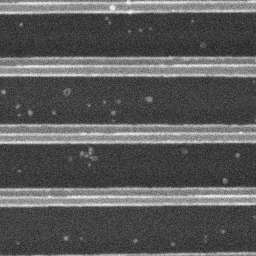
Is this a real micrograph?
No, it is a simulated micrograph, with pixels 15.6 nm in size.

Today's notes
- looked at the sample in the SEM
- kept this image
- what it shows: lines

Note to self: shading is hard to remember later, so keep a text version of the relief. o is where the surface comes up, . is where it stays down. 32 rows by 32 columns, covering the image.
oooooooooooooooooooooooooooooooo
oooooooooooooooooo..............
................................
................................
................................
................................
................................
oooooooooooooooooooooooooooooooo
oooooooooooooooooooooooooooooooo
................................
................................
................................
................................
................................
................................
................................
oooooooooooooooooooooooooooooooo
oooooooooooooooooooooooooooooooo
................................
................................
................................
................................
................................
................................
oooooooooooooooooooooooooooooooo
oooooooooooooooooooooooooooooooo
................................
................................
................................
................................
................................
................................